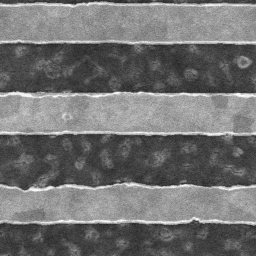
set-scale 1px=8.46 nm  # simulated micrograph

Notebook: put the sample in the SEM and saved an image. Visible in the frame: one or a few lines or trenches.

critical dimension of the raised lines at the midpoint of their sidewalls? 313 nanometers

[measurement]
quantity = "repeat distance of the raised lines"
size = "90.4 px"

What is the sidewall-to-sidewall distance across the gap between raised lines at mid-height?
452 nanometres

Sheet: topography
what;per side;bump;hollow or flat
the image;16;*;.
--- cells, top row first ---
****************
****************
****************
................
................
................
****************
****************
................
................
................
................
****************
****************
................
................